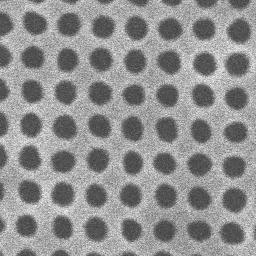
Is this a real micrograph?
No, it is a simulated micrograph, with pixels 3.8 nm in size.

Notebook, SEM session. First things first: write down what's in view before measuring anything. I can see a regular array of holes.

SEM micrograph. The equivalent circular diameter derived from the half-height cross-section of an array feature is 89.1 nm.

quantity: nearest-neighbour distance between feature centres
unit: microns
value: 0.126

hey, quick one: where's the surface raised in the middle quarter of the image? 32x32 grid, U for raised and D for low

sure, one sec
DDDUUUUDDDDDUUUDDDDDDUUUDDDDDUUU
DDDUUUUUDDDUUUUUDDDDUUUUDDDDDUUU
UUUUUUUUUUUUUUUUUUDUUUUUUUDDUUUU
UUUUUUUUUUUUUUUUUUUUUUUUUUUUUUUU
DDUUUUUDDUUUUUUUUUUUUUUUUUUUUUUU
DDDUUUDDDDDUUUUUDDDUUUUUUDDUUUUU
DDDUUUDDDDDDUUUDDDDDUUUUDDDDUUUU
DDDUUUDDDDDDUUUDDDDDUUUDDDDDDUUU
DDDUUUDDDDDDUUUDDDDDUUUDDDDDDUUU
DDUUUUUDDDDUUUUDDDDDUUUUDDDDUUUU
UUUUUUUUUUUUUUUUUUDUUUUUUDDDUUUU
UUUUUUUUUUUUUUUUUUUUUUUUUUUUUUUU
DUUUUUUUDUUUUUUUUUUUUUUUUUUUUUUU
DDUUUUUDDDDUUUUUDDDUUUUUDDDUUUUU
DDDUUUDDDDDUUUUDDDDUUUUDDDDDUUUU
DDDUUUDDDDDDUUDDDDDDUUUDDDDDUUUU
DDDUUUDDDDDDUUUDDDDDUUUDDDDDUUUU
DDDUUUUDDDDDUUUDDDDDUUUDDDDDUUUU
DDUUUUUUUDDUUUUUDDDUUUUUDDDDUUUU
UUUUUUUUUUUUUUUUUDUUUUUUUDDUUUUU
UUUUUUUUUUUUUUUUUUUUUUUUUUUUUUUU
UUUUUUUDDDUUUUUUUUUUUUUUUUUUUUUU
DDUUUUDDDDDUUUUDDDDUUUUDDDDUUUUU
DDDUUUDDDDDDUUUDDDDDUUUDDDDDUUUD
DDDUUUDDDDDUUUUDDDDDUUDDDDDDUUUD
DDDUUUDDDDDUUUUDDDDDUUDDDDDDUUUD
DDUUUUUDDDUUUUUDDDDUUUUDDDDDUUUD
UUUUUUUUUUUUUUUUDDUUUUUUUDUUUUUU
UUUUUUUUUUUUUUUUUUUUUUUUUUUUUUUU
UUUUUUUUUUUUUUUUUUUUUUUUUUUUUUUU
DDUUUUDDDUUUUUUDDDUUUUUUDDDUUUUU
DDDUUDDDDDUUUUDDDDDUUUUDDDDDUUUU